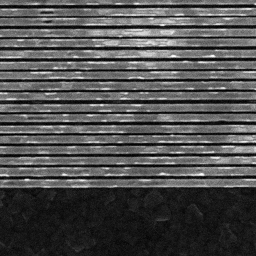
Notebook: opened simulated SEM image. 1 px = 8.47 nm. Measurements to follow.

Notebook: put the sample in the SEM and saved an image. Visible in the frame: parallel lines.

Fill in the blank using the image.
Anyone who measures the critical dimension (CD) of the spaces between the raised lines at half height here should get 28.6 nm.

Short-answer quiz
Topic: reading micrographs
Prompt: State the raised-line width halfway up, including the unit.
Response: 0.0625 microns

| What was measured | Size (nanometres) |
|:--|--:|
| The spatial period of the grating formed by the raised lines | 90.5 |